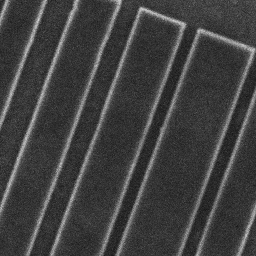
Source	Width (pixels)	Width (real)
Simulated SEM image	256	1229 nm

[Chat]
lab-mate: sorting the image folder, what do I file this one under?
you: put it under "one or a few lines or trenches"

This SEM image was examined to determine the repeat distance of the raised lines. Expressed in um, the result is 0.319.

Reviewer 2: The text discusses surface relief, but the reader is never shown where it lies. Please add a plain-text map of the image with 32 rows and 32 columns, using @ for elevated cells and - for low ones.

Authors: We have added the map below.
-@@@@@---@@@@@@-----------------
@@@@@----@@@@@@--@@-------------
@@@@@----@@@@@---@@@@@----------
@@@@----@@@@@@---@@@@@@---------
@@@@----@@@@@---@@@@@@@--@@-----
@@@@----@@@@@---@@@@@@--@@@@@@--
@@@----@@@@@@---@@@@@@--@@@@@@@@
@@@----@@@@@---@@@@@@@--@@@@@@@-
@@@---@@@@@@---@@@@@@--@@@@@@@@-
@@----@@@@@@---@@@@@@--@@@@@@@@-
@@----@@@@@---@@@@@@--@@@@@@@@--
@@---@@@@@@---@@@@@@--@@@@@@@@--
@----@@@@@@--@@@@@@@--@@@@@@@@--
@----@@@@@---@@@@@@--@@@@@@@@--@
----@@@@@@---@@@@@@--@@@@@@@@--@
----@@@@@---@@@@@@@--@@@@@@@---@
----@@@@@---@@@@@@--@@@@@@@@--@@
---@@@@@@---@@@@@@--@@@@@@@@--@@
---@@@@@---@@@@@@@--@@@@@@@--@@@
--@@@@@@---@@@@@@--@@@@@@@@--@@@
--@@@@@@---@@@@@@--@@@@@@@@--@@@
--@@@@@---@@@@@@--@@@@@@@@--@@@@
-@@@@@@---@@@@@@--@@@@@@@@--@@@@
-@@@@@@--@@@@@@@--@@@@@@@@--@@@@
-@@@@@---@@@@@@--@@@@@@@@--@@@@@
@@@@@@---@@@@@@--@@@@@@@@--@@@@@
@@@@@---@@@@@@@--@@@@@@@---@@@@@
@@@@@---@@@@@@--@@@@@@@@--@@@@@@
@@@@@---@@@@@@--@@@@@@@@--@@@@@-
@@@@---@@@@@@@--@@@@@@@--@@@@@@-
@@@@---@@@@@@--@@@@@@@@--@@@@@--
@@@@---@@@@@@--@@@@@@@@--@@@@@--